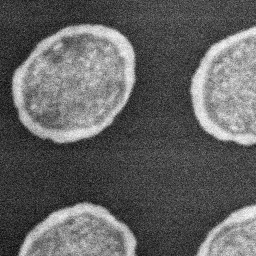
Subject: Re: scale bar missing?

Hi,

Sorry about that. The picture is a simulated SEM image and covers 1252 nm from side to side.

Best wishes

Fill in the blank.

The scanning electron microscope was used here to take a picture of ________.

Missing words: raised bodies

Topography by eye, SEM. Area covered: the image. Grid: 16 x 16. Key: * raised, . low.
................
................
...****.......**
..******.....***
.*******.....***
.*******....****
.*******....****
..*****......***
....*.........**
................
................
................
................
....***........*
..******.....***
.*******.....***